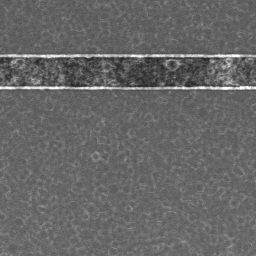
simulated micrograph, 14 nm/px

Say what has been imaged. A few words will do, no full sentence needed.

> one or a few lines or trenches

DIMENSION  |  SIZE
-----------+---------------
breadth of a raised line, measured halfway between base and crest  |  0.455 µm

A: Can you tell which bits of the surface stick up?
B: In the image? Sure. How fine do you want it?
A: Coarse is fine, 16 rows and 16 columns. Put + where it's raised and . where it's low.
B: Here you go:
................
................
................
++++++++++++++++
++++++++++++++++
....++.+++....++
................
................
................
................
................
................
................
................
................
................